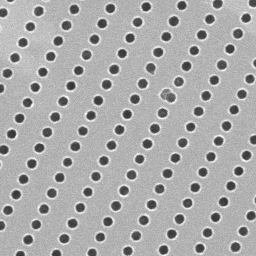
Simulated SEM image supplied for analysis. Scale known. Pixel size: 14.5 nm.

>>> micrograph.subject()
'a regular array of holes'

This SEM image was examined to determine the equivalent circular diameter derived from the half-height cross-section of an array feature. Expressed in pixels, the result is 10.3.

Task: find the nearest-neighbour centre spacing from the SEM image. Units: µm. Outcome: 0.25